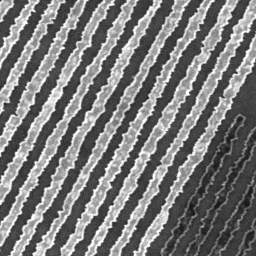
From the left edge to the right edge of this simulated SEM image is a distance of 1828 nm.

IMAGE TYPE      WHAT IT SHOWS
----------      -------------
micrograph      parallel lines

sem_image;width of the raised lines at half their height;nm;60.8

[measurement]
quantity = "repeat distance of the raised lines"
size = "155 nm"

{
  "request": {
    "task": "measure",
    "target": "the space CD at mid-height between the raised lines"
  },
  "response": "0.0877 um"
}